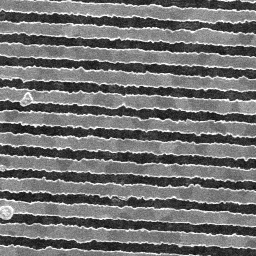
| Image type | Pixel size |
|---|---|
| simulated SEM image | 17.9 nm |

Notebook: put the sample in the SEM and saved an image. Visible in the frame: parallel lines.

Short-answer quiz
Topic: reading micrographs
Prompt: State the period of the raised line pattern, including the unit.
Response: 0.403 um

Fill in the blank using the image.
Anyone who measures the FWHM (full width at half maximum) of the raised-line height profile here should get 226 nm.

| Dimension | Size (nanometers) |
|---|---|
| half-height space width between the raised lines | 179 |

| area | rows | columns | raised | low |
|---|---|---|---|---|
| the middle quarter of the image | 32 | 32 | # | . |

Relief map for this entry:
...............................#
#####...........................
###########################.....
################################
..##..##########################
...............#..#.############
................................
############....................
###########################..##.
################################
.........#####.#################
.............................###
.##.............................
##################..............
############################.###
#.##############################
...................###.#########
................................
###.######......................
#########################.####..
################################
..#...##########################
......................###..#####
................................
#############...................
################################
################################
..........#...#..###############
...............................#
................................
######################....#....#
################################